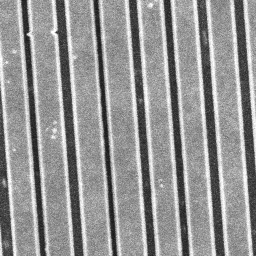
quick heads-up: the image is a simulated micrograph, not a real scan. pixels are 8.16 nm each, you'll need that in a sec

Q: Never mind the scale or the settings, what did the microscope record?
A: parallel lines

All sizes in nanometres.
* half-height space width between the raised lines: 86.5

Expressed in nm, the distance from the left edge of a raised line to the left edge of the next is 289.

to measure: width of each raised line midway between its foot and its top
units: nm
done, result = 204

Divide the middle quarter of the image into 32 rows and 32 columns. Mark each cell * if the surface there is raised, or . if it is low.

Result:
..******..*******...******..****
..******..*******...******..****
..******..*******...******..****
..******...******...******...***
..******...******...******...***
..******...******...******...***
..*******..******...******...***
..*******..******....*****...***
..*******..*******...*****...***
..*******..*******...*****...***
...******..*******...*****...***
...******..*******...*****...***
...******..*******...******..***
...******..*******...******..***
...******..*******...******..***
...******..*******...******...**
...******...******...******...**
...*******..******...******...**
...*******..******...******...**
...*******..******...******...**
...*******..******....*****...**
...*******..*******...*****...**
....******..*******...*****...**
....******..*******...*****...**
....******..*******...*****...**
*...******..*******...*****...**
....******..*******...******..**
....******..*******...******..**
*...******...******...******...*
*...******..*******...******...*
*...*******.*******...******...*
*...*******..******...******...*